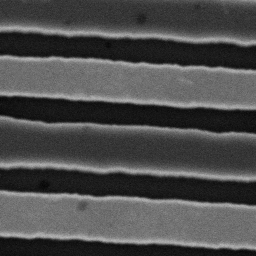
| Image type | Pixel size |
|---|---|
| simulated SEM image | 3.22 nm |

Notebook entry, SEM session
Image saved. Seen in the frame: lines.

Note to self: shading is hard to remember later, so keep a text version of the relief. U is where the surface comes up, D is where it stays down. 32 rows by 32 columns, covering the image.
UUUUUUUUUUUUUUUUUUUUUUUUUUUUUUUU
UUUUUUUUUUUUUUUUUUUUUUUUUUUUUUUU
UUUUUUUUUUUUUUUUUUUUUUUUUUUUUUUU
UUUUUUUUUUUUUUUUUUUUUUUUUUUUUUUU
DDDDDDDDDDDDUUUUUUUUUUUUUUUUUUUU
DDDDDDDDDDDDDDDDDDDDDDDDDDDDDDUU
DDDDDDDDDDDDDDDDDDDDDDDDDDDDDDDD
UUUUUUUUUUUUUDDDDDDDDDDDDDDDDDDD
UUUUUUUUUUUUUUUUUUUUUUUUUUDUDDDD
UUUUUUUUUUUUUUUUUUUUUUUUUUUUUUUU
UUUUUUUUUUUUUUUUUUUUUUUUUUUUUUUU
UUUUUUUUUUUUUUUUUUUUUUUUUUUUUUUU
DDDDDDDDDDUUUUUUUUUUUUUUUUUUUUUU
DDDDDDDDDDDDDDDDDDDDDDDDDDDUUUUU
DDDDDDDDDDDDDDDDDDDDDDDDDDDDDDDD
UUUUUUUUUUUUDDDDDDDDDDDDDDDDDDDD
UUUUUUUUUUUUUUUUUUUUUUUUUUDDDDDD
UUUUUUUUUUUUUUUUUUUUUUUUUUUUUUUU
UUUUUUUUUUUUUUUUUUUUUUUUUUUUUUUU
UUUUUUUUUUUUUUUUUUUUUUUUUUUUUUUU
UUUUUUUUUUUUUUUUUUUUUUUUUUUUUUUU
DDDDDDDDDDDDUUDDUUUUUUUUUUUUUUUU
DDDDDDDDDDDDDDDDDDDDDDDDDDDDDUUU
DDDDDDDDDDDDDDDDDDDDDDDDDDDDDDDD
UUUUUUUUUUUDDDDDDDDDDDDDDDDDDDDD
UUUUUUUUUUUUUUUUUUUUUUUUUUUUUDDD
UUUUUUUUUUUUUUUUUUUUUUUUUUUUUUUU
UUUUUUUUUUUUUUUUUUUUUUUUUUUUUUUU
UUUUUUUUUUUUUUUUUUUUUUUUUUUUUUUU
UUUUUUUUUUUUUUUUUUUUUUUUUUUUUUUU
DDDDDDDDDDDDDDDDDDDDDUUUUUUUUUUU
DDDDDDDDDDDDDDDDDDDDDDDDDDDDDDDD